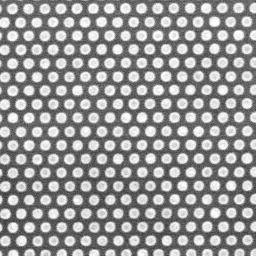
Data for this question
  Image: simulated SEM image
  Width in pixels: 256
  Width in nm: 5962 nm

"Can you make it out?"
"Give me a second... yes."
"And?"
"a regular array of raised bodies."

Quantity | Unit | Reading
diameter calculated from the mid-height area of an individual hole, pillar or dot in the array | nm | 214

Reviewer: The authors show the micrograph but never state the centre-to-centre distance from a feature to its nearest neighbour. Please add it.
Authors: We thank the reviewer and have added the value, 364 nanometers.